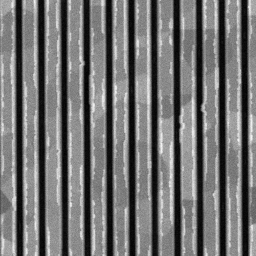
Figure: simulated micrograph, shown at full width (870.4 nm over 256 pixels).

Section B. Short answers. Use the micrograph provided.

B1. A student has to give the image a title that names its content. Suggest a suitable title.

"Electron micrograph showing parallel lines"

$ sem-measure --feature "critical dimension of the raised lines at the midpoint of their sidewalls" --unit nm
50.6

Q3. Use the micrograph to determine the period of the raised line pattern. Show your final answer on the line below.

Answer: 22.6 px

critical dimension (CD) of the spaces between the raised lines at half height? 0.0251 um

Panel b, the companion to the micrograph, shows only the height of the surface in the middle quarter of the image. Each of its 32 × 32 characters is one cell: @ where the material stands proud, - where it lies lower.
-@@@@--@@@--@@@@--@@@@--@@@--@@@
-@@@@--@@@--@@@@--@@@@--@@@--@@@
-@@@@--@@@--@@@@--@@@@--@@@--@@@
-@@@@--@@@--@@@@--@@@@--@@@--@@@
-@@@@--@@@--@@@@--@@@@--@@@--@@@
-@@@@--@@@--@@@@--@@@@--@@@--@@@
-@@@@--@@@--@@@@--@@@@--@@@--@@@
-@@@@--@@@--@@@@--@@@@--@@@--@@@
-@@@@--@@@--@@@@--@@@@--@@@--@@@
-@@@@--@@@--@@@@--@@@---@@@--@@@
-@@@@--@@@--@@@@--@@@---@@@--@@@
-@@@@--@@@--@@@@--@@@@--@@@--@@@
-@@@@--@@@--@@@@--@@@@--@@@--@@@
-@@@@--@@@--@@@@--@@@@--@@@--@@@
-@@@@--@@@--@@@@--@@@@--@@@--@@@
-@@@@--@@@--@@@@--@@@@--@@@--@@@
-@@@@--@@@--@@@@--@@@@--@@@--@@@
-@@@@--@@@--@@@@--@@@@--@@@--@@@
-@@@@--@@@--@@@@--@@@@--@@@--@@@
-@@@@--@@@--@@@@--@@@@--@@@--@@@
-@@@@--@@@--@@@@--@@@@--@@@--@@@
-@@@@--@@@--@@@@--@@@@--@@@--@@@
-@@@@--@@@--@@@@--@@@@--@@@--@@@
-@@@@--@@@--@@@@--@@@@--@@@--@@@
-@@@@--@@@--@@@@--@@@@--@@@--@@@
-@@@@--@@@--@@@@--@@@@--@@@--@@@
-@@@@--@@@--@@@@--@@@@--@@@--@@@
-@@@@--@@@--@@@@--@@@@--@@@--@@@
-@@@@--@@@--@@@@--@@@---@@@--@@@
-@@@@--@@@--@@@@--@@@---@@@--@@@
-@@@@--@@@--@@@@--@@@---@@@--@@@
-@@@@--@@@--@@@@--@@@@--@@@--@@@